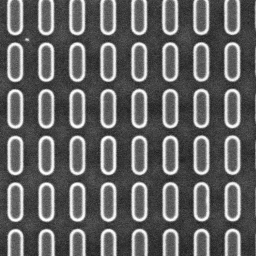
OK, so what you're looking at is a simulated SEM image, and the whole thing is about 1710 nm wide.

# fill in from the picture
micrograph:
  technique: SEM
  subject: groups of lines, slits or small figures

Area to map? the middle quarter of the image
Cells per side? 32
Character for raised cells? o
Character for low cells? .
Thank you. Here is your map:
..ooo....oooo....ooo.....ooo....
..ooo....oooo....ooo.....ooo....
..ooo....oooo....ooo.....ooo....
..ooo.....ooo.....oo.....ooo....
................................
................................
................................
..ooo.....ooo....ooo.....ooo....
..ooo....oooo....ooo.....ooo....
..ooo....oooo....ooo.....ooo....
..ooo....oooo....ooo.....ooo....
..ooo....oooo....ooo.....ooo....
..ooo....oooo....ooo.....ooo....
..ooo....oooo....ooo.....ooo....
..ooo....oooo....ooo.....ooo....
..oo......oo......oo.....ooo....
................................
................................
..oo......oo......oo.....ooo....
..ooo....oooo....ooo.....ooo....
..ooo....oooo....ooo.....ooo....
..ooo....oooo....ooo.....ooo....
..ooo....oooo....ooo.....ooo....
..ooo....oooo....ooo.....ooo....
..ooo....oooo....ooo.....ooo....
..ooo....oooo....ooo.....ooo....
..ooo.....ooo....ooo.....ooo....
...o............................
................................
................................
..ooo.....ooo.....oo.....ooo....
..ooo....oooo....ooo.....ooo....